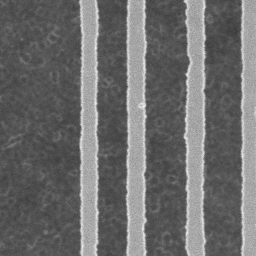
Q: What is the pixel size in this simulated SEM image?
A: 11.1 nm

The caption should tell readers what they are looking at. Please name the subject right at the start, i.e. parallel lines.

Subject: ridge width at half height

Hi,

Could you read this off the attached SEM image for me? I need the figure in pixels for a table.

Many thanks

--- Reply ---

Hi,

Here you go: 16.9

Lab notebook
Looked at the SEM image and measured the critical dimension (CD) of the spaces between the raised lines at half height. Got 422 nm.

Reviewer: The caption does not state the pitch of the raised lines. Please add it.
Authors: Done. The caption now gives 588 nm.